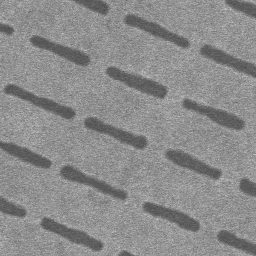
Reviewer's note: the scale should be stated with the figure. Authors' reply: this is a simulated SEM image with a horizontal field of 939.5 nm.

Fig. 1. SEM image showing a regular array of holes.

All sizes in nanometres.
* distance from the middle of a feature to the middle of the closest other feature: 202